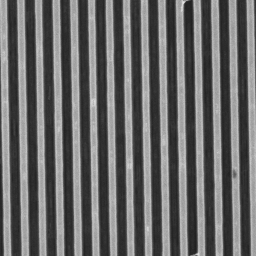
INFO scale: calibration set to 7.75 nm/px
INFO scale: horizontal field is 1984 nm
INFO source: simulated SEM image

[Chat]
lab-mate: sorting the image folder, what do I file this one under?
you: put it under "parallel lines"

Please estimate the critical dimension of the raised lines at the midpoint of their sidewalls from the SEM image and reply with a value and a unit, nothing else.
66.8 nanometers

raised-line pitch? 0.137 µm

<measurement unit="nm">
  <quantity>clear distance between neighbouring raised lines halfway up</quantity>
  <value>72.6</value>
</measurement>